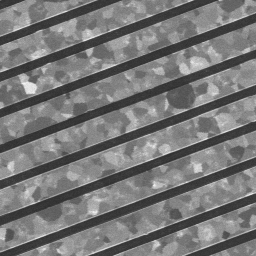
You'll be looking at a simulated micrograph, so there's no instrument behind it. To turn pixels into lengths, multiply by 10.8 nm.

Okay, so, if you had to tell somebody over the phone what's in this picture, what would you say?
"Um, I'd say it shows parallel lines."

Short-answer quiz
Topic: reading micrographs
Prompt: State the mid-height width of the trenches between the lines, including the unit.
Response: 97.1 nm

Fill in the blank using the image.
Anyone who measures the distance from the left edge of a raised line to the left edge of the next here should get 366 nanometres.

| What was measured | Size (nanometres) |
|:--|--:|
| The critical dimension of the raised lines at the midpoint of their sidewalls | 269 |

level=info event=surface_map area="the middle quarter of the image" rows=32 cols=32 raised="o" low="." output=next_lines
ooooooooooooo......ooooooooooooo
oooooooooo......oooooooooooooooo
ooooooo.......ooooooooooooooooo.
oooo.......oooooooooooooooooo...
oo......oooooooooooooooooo......
......ooooooooooooooooo.......oo
...oooooooooooooooooo......ooooo
oooooooooooooooooo......oooooooo
ooooooooooooooo.......oooooooooo
ooooooooooooo......ooooooooooooo
oooooooooo......oooooooooooooooo
ooooooo.......ooooooooooooooooo.
oooo.......ooooooooooooooooo....
oo......ooooooooooooooooo.......
......ooooooooooooooooo.......oo
...ooooooooooooooooo.......ooooo
ooooooooooooooooo.......oooooooo
oooooooooooooo........oooooooooo
oooooooooooo.......ooooooooooooo
ooooooooo.......oooooooooooooooo
oooooo........ooooooooooooooooo.
oooo.......oooooooooooooooooo...
o.......oooooooooooooooooo......
......ooooooooooooooooo.......oo
...oooooooooooooooooo......ooooo
ooooooooooooooooo.......oooooooo
oooooooooooooo........oooooooooo
oooooooooooo.......ooooooooooooo
ooooooooo.......oooooooooooooooo
oooooo........ooooooooooooooooo.
oooo.......oooooooooooooooooo...
o.......ooooooooooooooooo.......